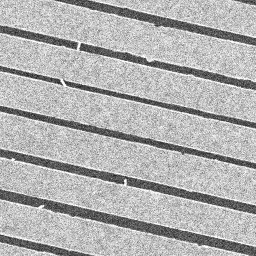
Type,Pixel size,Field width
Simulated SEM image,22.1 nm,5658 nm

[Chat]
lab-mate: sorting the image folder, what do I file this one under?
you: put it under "parallel lines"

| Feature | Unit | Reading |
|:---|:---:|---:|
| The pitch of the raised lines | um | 0.899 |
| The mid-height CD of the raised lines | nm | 698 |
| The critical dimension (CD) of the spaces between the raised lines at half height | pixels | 8.9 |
